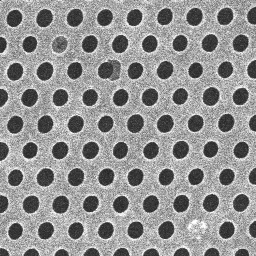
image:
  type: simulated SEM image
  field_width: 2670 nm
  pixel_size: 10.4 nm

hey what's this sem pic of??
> a regular array of holes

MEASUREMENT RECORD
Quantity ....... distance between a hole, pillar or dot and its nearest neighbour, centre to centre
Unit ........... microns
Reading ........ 0.31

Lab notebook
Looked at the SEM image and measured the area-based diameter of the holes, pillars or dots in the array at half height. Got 174 nm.